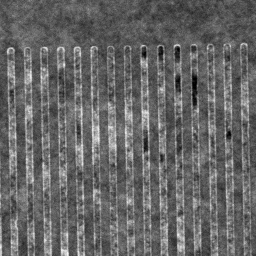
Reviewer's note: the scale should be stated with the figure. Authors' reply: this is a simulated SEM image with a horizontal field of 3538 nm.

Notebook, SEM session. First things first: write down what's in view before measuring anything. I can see parallel lines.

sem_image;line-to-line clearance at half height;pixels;9.87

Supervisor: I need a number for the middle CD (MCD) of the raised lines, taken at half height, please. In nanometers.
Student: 96.7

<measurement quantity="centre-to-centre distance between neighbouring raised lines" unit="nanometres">230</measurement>